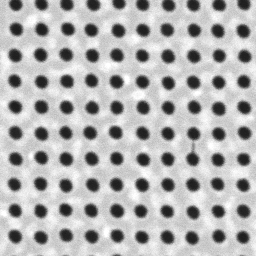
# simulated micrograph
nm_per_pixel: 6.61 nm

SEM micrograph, a regular array of holes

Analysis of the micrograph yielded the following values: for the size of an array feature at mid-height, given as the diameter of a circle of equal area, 0.096 micrometres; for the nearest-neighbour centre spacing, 165 nm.